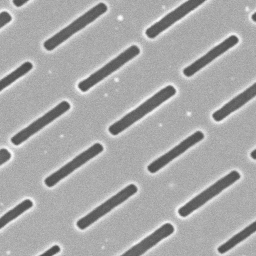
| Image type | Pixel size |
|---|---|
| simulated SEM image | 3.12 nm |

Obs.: a regular array of holes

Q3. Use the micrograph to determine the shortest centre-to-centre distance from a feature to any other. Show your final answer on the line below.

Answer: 167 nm